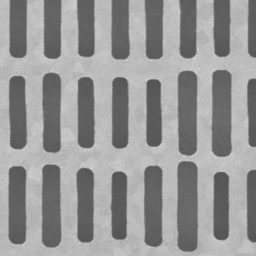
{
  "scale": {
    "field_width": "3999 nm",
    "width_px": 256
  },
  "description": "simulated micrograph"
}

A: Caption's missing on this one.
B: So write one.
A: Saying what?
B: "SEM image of a regular array of holes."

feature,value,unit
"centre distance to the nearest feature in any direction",529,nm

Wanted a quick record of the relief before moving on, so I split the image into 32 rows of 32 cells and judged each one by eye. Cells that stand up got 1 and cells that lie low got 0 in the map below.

10011000110011001100110001100110
10011000110011001100110001100110
10011000110011001100110001100110
10011100110011001100110001100110
10011000110011001100110001100110
10011000110011001100110001100110
10011000110011001100111001100110
11111111111111111111111111111111
11111111111111111111111111111111
11111101111111111111110001100111
10011000110011001100110001000110
10011000110011001100110001000110
10011000110011001100110001000110
10011000110011001100110001000110
10011000110011001100110001000110
10011000110011001100110001000110
10011000110011001100110001000110
10011000110011001100110001000110
11011000110111111111110001100111
11111111111111111111111111101111
11111111111111111111110011111111
10011000110011011100110001111110
10011000110011001100110001100110
10011000110011001100110001100110
10011000110011001100110001100110
10011000110011001100110001100110
10011000110011001100110001100110
10011000110011001100110001100110
10011000110011001100110001100110
10011000110011001100110001100110
11111101111111111100110001111111
11111111111111111111111111111111